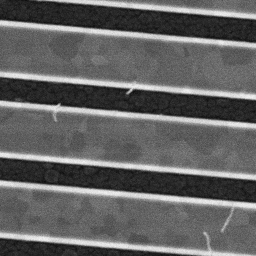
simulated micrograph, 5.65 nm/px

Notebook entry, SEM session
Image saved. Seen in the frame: one or a few lines or trenches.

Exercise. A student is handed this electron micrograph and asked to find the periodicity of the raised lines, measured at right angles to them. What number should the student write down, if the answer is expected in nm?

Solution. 452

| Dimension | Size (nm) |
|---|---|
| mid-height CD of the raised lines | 289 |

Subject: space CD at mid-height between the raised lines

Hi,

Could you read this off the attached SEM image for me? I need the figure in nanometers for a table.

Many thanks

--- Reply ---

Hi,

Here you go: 163